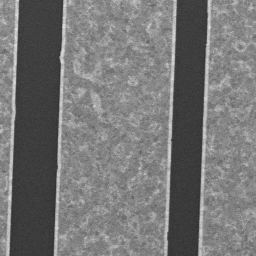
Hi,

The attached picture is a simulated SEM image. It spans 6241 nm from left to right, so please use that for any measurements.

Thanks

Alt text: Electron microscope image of one or a few lines or trenches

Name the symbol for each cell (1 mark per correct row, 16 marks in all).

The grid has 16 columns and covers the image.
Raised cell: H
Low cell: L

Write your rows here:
HLLLHHHHHHHLLHHH
HLLLHHHHHHHLLHHH
HLLLHHHHHHHLLHHH
HLLLHHHHHHHLLHHH
HLLLHHHHHHHLLHHH
HLLLHHHHHHHLLHHH
HLLLHHHHHHHLLHHH
HLLLHHHHHHHLLHHH
HLLLHHHHHHHLLHHH
HLLLHHHHHHHLLHHH
HLLLHHHHHHHLLHHH
HLLLHHHHHHHLLHHH
HLLLHHHHHHLLLHHH
HLLLHHHHHHLLLHHH
HLLLHHHHHHLLLHHH
LLLHHHHHHHLLLHHH